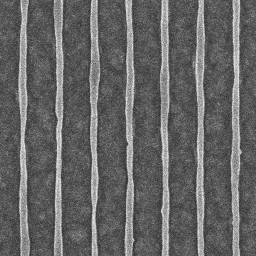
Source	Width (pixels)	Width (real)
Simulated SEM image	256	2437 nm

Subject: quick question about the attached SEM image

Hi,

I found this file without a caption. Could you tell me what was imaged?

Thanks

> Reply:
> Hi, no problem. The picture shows parallel lines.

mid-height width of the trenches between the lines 283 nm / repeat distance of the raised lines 337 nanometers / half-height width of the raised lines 6.12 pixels